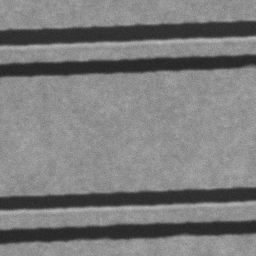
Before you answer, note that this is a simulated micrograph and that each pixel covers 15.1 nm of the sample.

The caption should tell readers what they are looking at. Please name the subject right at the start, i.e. lines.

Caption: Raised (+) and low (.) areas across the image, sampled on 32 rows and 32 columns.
++++++++++++++++++++++++++++++++
++++++++++++++++++++++++++++++++
++++++++++++++++++++++++++++++..
++++++..........................
................................
..........++++++++++++++++++++++
++++++++++++++++++++++++++++++++
+++++++++++.....................
................................
.........+++++++++++++++++++++++
++++++++++++++++++++++++++++++++
++++++++++++++++++++++++++++++++
++++++++++++++++++++++++++++++++
++++++++++++++++++++++++++++++++
++++++++++++++++++++++++++++++++
++++++++++++++++++++++++++++++++
++++++++++++++++++++++++++++++++
++++++++++++++++++++++++++++++++
++++++++++++++++++++++++++++++++
++++++++++++++++++++++++++++++++
++++++++++++++++++++++++++++++++
++++++++++++++++++++++++++++++++
++++++++++++++++++++++++++++++++
+++++++++++++++++++++++++++.....
................................
............................++++
++++++++++++++++++++++++++++++++
+++++++++++++++++++++++++++++++.
++..............................
...........................+++++
..++++++++++++++++++++++++++++++
++++++++++++++++++++++++++++++++